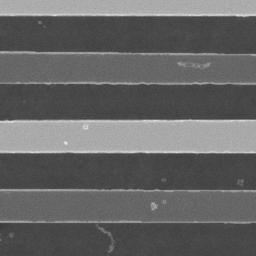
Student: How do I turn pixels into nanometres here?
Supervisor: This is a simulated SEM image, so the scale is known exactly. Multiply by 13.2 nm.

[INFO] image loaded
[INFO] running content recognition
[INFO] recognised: lines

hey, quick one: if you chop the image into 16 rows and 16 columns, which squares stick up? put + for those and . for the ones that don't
++++++++++++++++
................
................
++++++++++++++++
++++++++++++++++
................
................
................
++++++++++++++++
++++++++++++++++
................
................
++++++++++++++++
++++++++++++++++
................
................